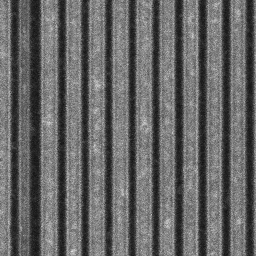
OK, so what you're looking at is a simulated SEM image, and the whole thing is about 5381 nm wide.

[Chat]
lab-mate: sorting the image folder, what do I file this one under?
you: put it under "parallel lines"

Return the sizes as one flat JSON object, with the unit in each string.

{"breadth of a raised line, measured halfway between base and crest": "255 nm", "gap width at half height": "11.4 px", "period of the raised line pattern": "0.493 microns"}